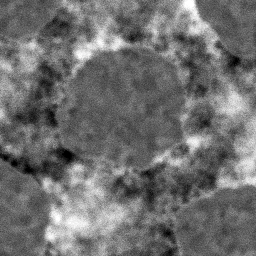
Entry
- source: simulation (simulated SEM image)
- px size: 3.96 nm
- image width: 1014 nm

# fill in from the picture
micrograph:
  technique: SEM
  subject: raised bodies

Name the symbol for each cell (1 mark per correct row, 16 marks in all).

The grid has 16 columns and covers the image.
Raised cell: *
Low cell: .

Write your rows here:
****........****
***..........***
..............**
......****......
.....******.....
....*******.....
....********....
....*******.....
....*******.....
.....*****......
*.......*.......
**..............
***.........****
***........*****
***........*****
***........*****